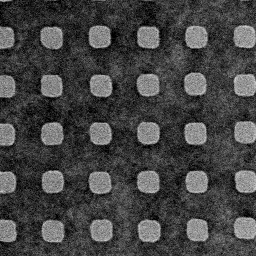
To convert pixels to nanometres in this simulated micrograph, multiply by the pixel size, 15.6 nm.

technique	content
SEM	a regular array of raised bodies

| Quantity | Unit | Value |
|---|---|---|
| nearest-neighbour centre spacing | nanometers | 742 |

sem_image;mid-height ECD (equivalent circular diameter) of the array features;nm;361